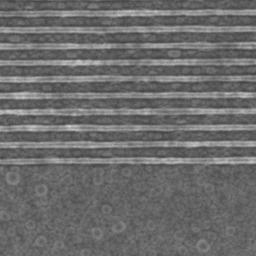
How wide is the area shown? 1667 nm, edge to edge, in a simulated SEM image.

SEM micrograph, parallel lines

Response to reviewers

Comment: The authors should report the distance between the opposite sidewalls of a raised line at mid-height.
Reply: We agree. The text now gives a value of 23.6 nm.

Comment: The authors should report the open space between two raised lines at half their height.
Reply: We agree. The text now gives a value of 81.4 nm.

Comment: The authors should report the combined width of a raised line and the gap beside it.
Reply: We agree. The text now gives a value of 107 nm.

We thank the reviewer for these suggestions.